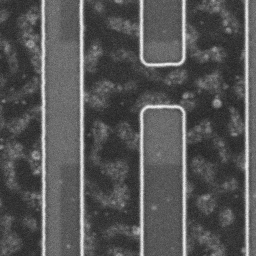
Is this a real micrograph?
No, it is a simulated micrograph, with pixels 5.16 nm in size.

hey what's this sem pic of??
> one or a few lines or trenches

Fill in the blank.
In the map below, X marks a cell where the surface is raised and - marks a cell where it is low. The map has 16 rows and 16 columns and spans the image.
XXX--XXXX---XXX-
XXX--XXXX---XXX-
XXX--XXXX---XXX-
XXX--XXXX--XXXX-
XXX--XXXXXXXXXX-
XXX--XXXXXXXXXX-
XXX--XXXXXXXXXX-
XXX--XXXX---XXX-
XXX--XXXX---XXX-
XXX--XXXX---XXX-
XXX--XXXX---XXX-
XXX--XXXX---XXX-
XXX--XXXX---XXX-
XXX--XXXX---XXX-
XXX--XXXX---XXX-
XXX--XXXX---XXX-